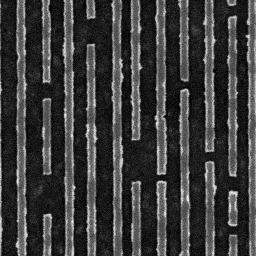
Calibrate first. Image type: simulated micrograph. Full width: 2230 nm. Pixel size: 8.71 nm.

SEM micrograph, parallel lines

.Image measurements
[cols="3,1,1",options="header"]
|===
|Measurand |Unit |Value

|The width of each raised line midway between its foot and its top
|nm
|69.7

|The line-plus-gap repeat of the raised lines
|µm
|0.204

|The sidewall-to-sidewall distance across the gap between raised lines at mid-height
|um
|0.131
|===